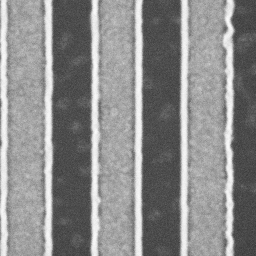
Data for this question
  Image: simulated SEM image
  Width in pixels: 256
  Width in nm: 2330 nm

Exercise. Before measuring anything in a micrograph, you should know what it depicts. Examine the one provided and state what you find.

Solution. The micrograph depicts one or a few lines or trenches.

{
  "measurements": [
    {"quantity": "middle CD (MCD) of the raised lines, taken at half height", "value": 47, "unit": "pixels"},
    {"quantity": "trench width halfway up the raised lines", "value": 396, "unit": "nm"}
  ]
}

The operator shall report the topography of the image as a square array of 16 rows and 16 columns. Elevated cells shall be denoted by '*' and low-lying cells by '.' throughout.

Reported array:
...***...***..**
...***...***..**
...***...***..**
...***...***..**
...***...***..**
...***...***..**
...***...**...**
...***...***..**
...***...***..**
...***...***..**
...***...***..**
...***...***..**
...***...**...**
...***...***..**
...***...***..**
...***...***..**